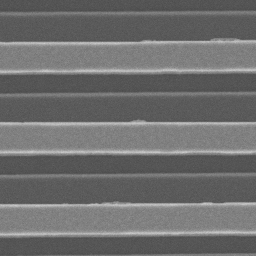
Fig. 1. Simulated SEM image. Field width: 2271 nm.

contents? lines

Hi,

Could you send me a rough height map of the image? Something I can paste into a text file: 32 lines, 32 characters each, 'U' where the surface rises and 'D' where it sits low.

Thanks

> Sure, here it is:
DDDDDDDDDDDDDDDDDDDDDDDDDDDDDDDD
DDDDDDDDDDDDDDDDDDDDDDDDDDDDDDDD
DDDDDDDDDDDDDDDDDDDDDDDDDDDDDDDD
DDDDDDDDDDDDDDDDDDDDDDDDDDDDDDDD
DDDDDDDDDDDDDDDDDDDDDDDDDDDDDDDD
UUUUUUUUUUUUUUUUUUUUUUUUUUUUUUUU
UUUUUUUUUUUUUUUUUUUUUUUUUUUUUUUU
UUUUUUUUUUUUUUUUUUUUUUUUUUUUUUUU
UUUUUUUUUUUUUUUUUUUUUUUUUUUUUUUU
DDDDDDDDDDDDDDDDDDDDDDDDDDDDDDDD
DDDDDDDDDDDDDDDDDDDDDDDDDDDDDDDD
DDDDDDDDDDDDDDDDDDDDDDDDDDDDDDDD
DDDDDDDDDDDDDDDDDDDDDDDDDDDDDDDD
DDDDDDDDDDDDDDDDDDDDDDDDDDDDDDDD
DDDDDDDDDDDDDDDDDDDDDDDDDDDDDDDD
UUUUUUUUUUUUUUUUUUUUUUUUUUUUUUUU
UUUUUUUUUUUUUUUUUUUUUUUUUUUUUUUU
UUUUUUUUUUUUUUUUUUUUUUUUUUUUUUUU
UUUUUUUUUUUUUUUUUUUUUUUUUUUUUUUU
DDDDDDDDDDDDDDDDDDDDDDDDDDDDDDDD
DDDDDDDDDDDDDDDDDDDDDDDDDDDDDDDD
DDDDDDDDDDDDDDDDDDDDDDDDDDDDDDDD
DDDDDDDDDDDDDDDDDDDDDDDDDDDDDDDD
DDDDDDDDDDDDDDDDDDDDDDDDDDDDDDDD
DDDDDDDDDDDDDDDDDDDDDDDDDDDDDDDD
DDDDDDDDDDDUUUUDUUUUUUUUUUUUUUUU
UUUUUUUUUUUUUUUUUUUUUUUUUUUUUUUU
UUUUUUUUUUUUUUUUUUUUUUUUUUUUUUUU
UUUUUUUUUUUUUUUUUUUUUUUUUUUUUUUU
DDDDDDDDDDDDDDDDDDDDDDDDDDDDDDDD
DDDDDDDDDDDDDDDDDDDDDDDDDDDDDDDD
DDDDDDDDDDDDDDDDDDDDDDDDDDDDDDDD